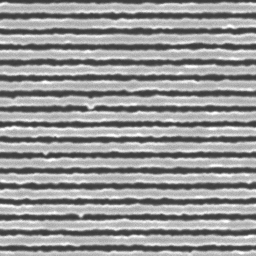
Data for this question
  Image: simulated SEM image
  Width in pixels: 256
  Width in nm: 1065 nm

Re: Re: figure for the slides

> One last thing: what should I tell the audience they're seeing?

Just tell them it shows parallel lines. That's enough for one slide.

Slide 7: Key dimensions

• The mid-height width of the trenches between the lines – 23.4 nm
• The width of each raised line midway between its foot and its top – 42.2 nanometers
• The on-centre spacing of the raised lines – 64.5 nm